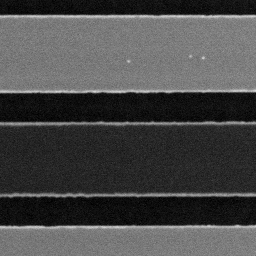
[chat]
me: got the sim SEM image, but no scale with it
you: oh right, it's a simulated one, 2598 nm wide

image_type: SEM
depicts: lines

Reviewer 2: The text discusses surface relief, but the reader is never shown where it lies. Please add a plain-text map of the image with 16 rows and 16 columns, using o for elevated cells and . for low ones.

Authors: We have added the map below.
................
oooooooooooooooo
oooooooooooooooo
oooooooooooooooo
oooooooooooooooo
oooooooooooooooo
................
................
oooooooooooooooo
oooooooooooooooo
oooooooooooooooo
oooooooooooooooo
................
................
oooooooooooooooo
oooooooooooooooo